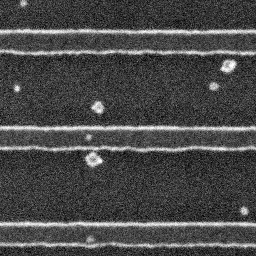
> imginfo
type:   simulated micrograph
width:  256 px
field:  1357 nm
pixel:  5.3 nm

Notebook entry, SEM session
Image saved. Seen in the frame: lines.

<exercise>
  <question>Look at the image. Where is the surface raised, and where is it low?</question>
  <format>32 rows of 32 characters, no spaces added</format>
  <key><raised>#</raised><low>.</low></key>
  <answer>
................................
................................
................................
................................
################################
################################
.###############################
................................
................................
................................
................................
................................
................................
................................
................................
................................
################################
################################
########################.#######
................................
................................
................................
................................
................................
................................
................................
................................
................................
################################
################################
################################
................................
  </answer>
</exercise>